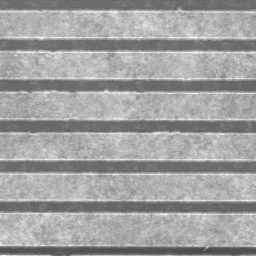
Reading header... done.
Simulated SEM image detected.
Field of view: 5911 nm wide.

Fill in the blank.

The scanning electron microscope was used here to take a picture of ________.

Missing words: parallel lines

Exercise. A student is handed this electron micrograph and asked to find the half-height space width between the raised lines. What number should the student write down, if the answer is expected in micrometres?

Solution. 0.294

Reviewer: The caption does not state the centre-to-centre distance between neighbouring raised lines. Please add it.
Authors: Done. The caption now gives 948 nm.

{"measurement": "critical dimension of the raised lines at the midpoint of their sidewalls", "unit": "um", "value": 0.641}